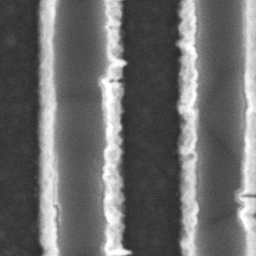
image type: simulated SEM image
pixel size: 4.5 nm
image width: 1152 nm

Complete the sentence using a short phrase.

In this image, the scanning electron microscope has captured one or a few lines or trenches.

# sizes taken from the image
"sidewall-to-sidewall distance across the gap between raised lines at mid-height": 328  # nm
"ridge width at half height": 299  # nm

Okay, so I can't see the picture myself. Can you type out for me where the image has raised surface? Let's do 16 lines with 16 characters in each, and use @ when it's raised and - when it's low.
---@@@@-----@@@@
---@@@@-----@@@@
---@@@@-----@@@@
---@@@@-----@@@@
---@@@@-----@@@@
---@@@@-----@@@@
---@@@@-----@@@@
---@@@@-----@@@@
---@@@@-----@@@@
---@@@@-----@@@@
---@@@@-----@@@@
---@@@@-----@@@@
---@@@@-----@@@@
---@@@@-----@@@@
---@@@@-----@@@@
---@@@@-----@@@@